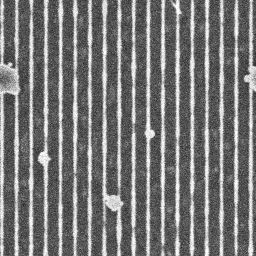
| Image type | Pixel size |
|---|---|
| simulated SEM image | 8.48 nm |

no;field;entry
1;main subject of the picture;parallel lines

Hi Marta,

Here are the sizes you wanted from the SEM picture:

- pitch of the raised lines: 124 nanometers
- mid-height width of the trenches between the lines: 104 nanometres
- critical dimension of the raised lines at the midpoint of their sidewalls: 15.9 nanometers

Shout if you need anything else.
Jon